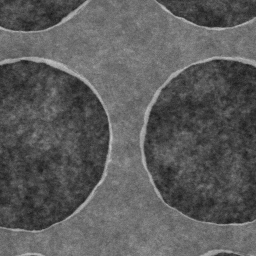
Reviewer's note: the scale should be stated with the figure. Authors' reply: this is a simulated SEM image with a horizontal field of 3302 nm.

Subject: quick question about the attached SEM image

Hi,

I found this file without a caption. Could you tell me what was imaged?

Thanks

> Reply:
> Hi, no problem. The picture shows holes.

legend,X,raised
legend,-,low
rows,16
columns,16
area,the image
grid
-----XXXXX------
----XXXXXXXX---X
XXXXXXXXXXXXXXXX
XXXXXXXXXXXXXXXX
----XXXXXXX-----
------XXXX------
------XXX-------
-------XX-------
-------XX-------
-------XX-------
-------XX-------
------XXXX------
-----XXXXX------
----XXXXXXXX----
XXXXXXXXXXXXXXXX
XXXXXXXXXXXXXXXX